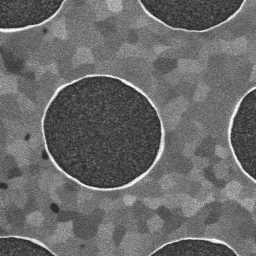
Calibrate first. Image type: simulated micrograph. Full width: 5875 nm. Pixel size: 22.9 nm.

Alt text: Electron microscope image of holes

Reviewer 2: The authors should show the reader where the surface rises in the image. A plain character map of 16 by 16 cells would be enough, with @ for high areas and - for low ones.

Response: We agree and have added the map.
----@@@@@------@
--@@@@@@@@----@@
@@@@@@@@@@@@@@@@
@@@@@@@@@@@@@@@@
@@@@@@@@@@@@@@@@
@@@@----@@@@@@@@
@@@------@@@@@@-
@@@-------@@@@@-
@@@-------@@@@--
@@@-------@@@@@-
@@@@-----@@@@@@-
@@@@@---@@@@@@@@
@@@@@@@@@@@@@@@@
@@@@@@@@@@@@@@@@
@@@@@@@@@@@@@@@@
---@@@@@@@----@@